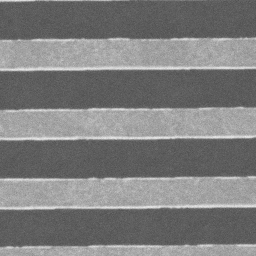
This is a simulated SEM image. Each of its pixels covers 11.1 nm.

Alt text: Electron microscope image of lines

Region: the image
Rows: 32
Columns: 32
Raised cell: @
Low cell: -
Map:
--------------------------------
--------------------------------
--------------------------------
--------------------------------
--------------------------------
@@@@@@@@@@@@@@@@@@@@@@@@@@@@@@@@
@@@@@@@@@@@@@@@@@@@@@@@@@@@@@@@@
@@@@@@@@@@@@@@@@@@@@@@@@@@@@@@@@
@@@@@@@@@@@@@@@@@@@@@@@@@@@@@@@-
--------------------------------
--------------------------------
--------------------------------
--------------------------------
--------------------------------
@@@@@@@@@@@@@@@@@@@@@@@@@@@@@@@@
@@@@@@@@@@@@@@@@@@@@@@@@@@@@@@@@
@@@@@@@@@@@@@@@@@@@@@@@@@@@@@@@@
--------------------------------
--------------------------------
--------------------------------
--------------------------------
--------------------------------
@@@@@@@@@@@@@@@@@@@@@@@@@@@@@@@@
@@@@@@@@@@@@@@@@@@@@@@@@@@@@@@@@
@@@@@@@@@@@@@@@@@@@@@@@@@@@@@@@@
@@@@@@@@@@@@@@@@@@@@@@@@@@@@@@@@
--------------------------------
--------------------------------
--------------------------------
--------------------------------
--------------------------------
@@@@@@@@@@@@@@@@@@@@@@@@@@@@@@@@